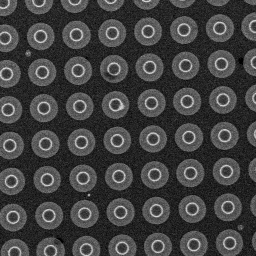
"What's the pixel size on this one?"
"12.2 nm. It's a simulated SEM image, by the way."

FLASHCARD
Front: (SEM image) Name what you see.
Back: an array of small figures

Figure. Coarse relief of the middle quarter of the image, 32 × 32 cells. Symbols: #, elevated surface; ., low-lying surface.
#######..#######..#######..#####
#######..#######..#######..#####
#######..#######..######....####
.######...#####....#####.....###
..####.....###..................
................................
.....................##......###
..###......####....######...####
.######...######...######..#####
.######...######...######..#####
.######...######...######...####
.######...######...######...####
.######...#####.....####.....###
..####......##..................
................................
.....................##......###
...###.....#####....#####...####
..#####...######...######...####
.#######..#######..#######..####
.#######..#######..#######..####
.#######..######...######....###
.######....#####....####......##
...###..........................
................................
......................##.....###
...###......####....#####....###
..#####....######...######..####
..######..#######..#######..####
.#######..#######..#######..####
..######...######...######...###
..######...#####.....####.....##
...####......##.................